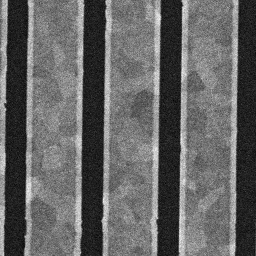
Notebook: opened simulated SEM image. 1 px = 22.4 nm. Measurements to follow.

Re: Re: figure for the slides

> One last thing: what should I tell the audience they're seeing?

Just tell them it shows one or a few lines or trenches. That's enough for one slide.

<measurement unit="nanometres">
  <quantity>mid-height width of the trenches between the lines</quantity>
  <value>593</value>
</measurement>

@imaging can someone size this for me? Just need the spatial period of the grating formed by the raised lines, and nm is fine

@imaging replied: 1730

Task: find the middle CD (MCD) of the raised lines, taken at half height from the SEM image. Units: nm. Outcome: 1140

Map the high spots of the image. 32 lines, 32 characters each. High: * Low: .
*...******....******...******...
*...******....******...******...
*...******....******...******...
*...******....******...******...
*...******....******...******...
....******....******...******...
....******....******...******...
....******....******...******...
....******...*******...******...
....******...*******...******...
....******...*******...******...
....******...*******...******...
....******...*******...******...
....******...*******...******...
....******...*******...******...
....******...*******...******...
....******...*******...******...
....******...*******...******...
....******...*******...******...
....******...*******...******...
....******...******....******...
....******...******....******...
....******...******....******...
....******...******....******...
....******...******....******...
....******...******....******...
....******...******....******...
....******...******....******...
....******...******....******...
...*******...******....******...
...*******...******....******...
...*******...******....******...